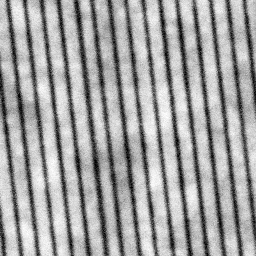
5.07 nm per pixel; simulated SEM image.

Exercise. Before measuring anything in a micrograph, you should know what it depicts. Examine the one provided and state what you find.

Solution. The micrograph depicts parallel lines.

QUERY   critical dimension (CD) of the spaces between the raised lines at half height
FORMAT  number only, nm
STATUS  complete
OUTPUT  17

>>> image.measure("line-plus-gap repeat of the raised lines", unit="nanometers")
85.1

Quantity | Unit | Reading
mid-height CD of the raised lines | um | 0.068